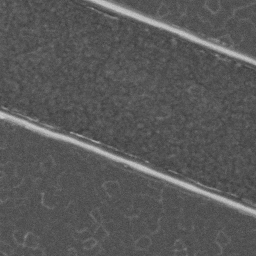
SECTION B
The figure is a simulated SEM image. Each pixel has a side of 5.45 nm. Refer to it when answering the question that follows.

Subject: one or a few lines or trenches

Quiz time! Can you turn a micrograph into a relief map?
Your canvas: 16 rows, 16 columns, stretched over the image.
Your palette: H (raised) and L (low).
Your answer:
LLLLLLLHHHHHHHHH
LLLLLLLLLLHHHHHH
LLLLLLLLLLLLHHHH
LLLLLLLLLLLLLLLH
LLLLLLLLLLLLLLLL
LLLLLLLLLLLLLLLL
LLLLLLLLLLLLLLLL
HLLLLLLLLLLLLLLL
HHHHLLLLLLLLLLLL
HHHHHHLLLLLLLLLL
HHHHHHHHHLLLLLLL
HHHHHHHHHHHLLLLL
HHHHHHHHHHHHHHLL
HHHHHHHHHHHHHHHH
HHHHHHHHHHHHHHHH
HHHHHHHHHHHHHHHH